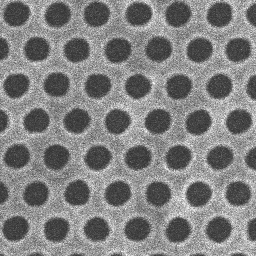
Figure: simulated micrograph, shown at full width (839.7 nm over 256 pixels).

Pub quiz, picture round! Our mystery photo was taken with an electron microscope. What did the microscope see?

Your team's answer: a regular array of holes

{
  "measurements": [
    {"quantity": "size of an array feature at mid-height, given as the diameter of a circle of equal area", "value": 89.3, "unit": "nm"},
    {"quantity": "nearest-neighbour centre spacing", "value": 132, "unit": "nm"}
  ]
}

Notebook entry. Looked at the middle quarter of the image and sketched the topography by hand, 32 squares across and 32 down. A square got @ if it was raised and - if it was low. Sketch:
@@@@@@@@@@@@@@@@@@@@@@@@@@@@@@@@
@@@@@@@@@@@@@@@@@@@@@@@@@@@@@@@@
-@@@@@@---@@@@@@@---@@@@@@@@--@@
-@@@@@-----@@@@@-----@@@@@------
--@@@-------@@@-------@@@@------
--@@@-------@@@-------@@@-------
--@@@-------@@@-------@@@@------
-@@@@------@@@@@-----@@@@@-----@
@@@@@@@---@@@@@@@---@@@@@@----@@
@@@@@@@@@@@@@@@@@@@@@@@@@@@@@@@@
@@@@@@@@@@@@@@@@@@@@@@@@@@@@@@@@
@@----@@@@@----@@@@@@@---@@@@@@@
@-----@@@@@-----@@@@@------@@@@-
-------@@@-------@@@-------@@@--
-------@@@-------@@@-------@@@--
------@@@@-------@@@-------@@@--
@----@@@@@@-----@@@@@-----@@@@@-
@@--@@@@@@@@--@@@@@@@@@--@@@@@@-
@@@@@@@@@@@@@@@@@@@@@@@@@@@@@@@@
@@@@@@@@@@@@@@@@@@@@@@@@@@@@@@@@
@@@@@@@---@@@@@@@---@@@@@@@---@@
-@@@@@-----@@@@@------@@@@------
--@@@-------@@@-------@@@-------
--@@@-------@@@-------@@@-------
-@@@@-------@@@-------@@@-------
-@@@@------@@@@------@@@@@-----@
@@@@@@@---@@@@@@@--@@@@@@@----@@
@@@@@@@@@@@@@@@@@@@@@@@@@@@@@@@@
@@@@@@@@@@@@@@@@@@@@@@@@@@@@@@@@
@----@@@@@@@----@@@@@@---@@@@@@@
@-----@@@@@-----@@@@@-----@@@@@-
-------@@@-------@@@-------@@@--